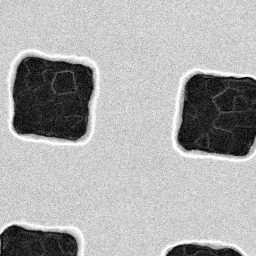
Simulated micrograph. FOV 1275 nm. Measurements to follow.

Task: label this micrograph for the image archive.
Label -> holes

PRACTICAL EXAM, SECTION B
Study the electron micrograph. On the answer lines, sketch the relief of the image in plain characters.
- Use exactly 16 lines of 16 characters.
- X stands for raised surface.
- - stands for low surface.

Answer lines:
XXXXXXXXXXXXXXXX
XXXXXXXXXXXXXXXX
XXXXXXXXXXXXXXXX
XX-XXXXXXXXXXXXX
X-----XXXXXXXXXX
X-----XXXXX-----
X-----XXXXX-----
X-----XXXXX-----
XX---XXXXXX-----
XXXXXXXXXXXX----
XXXXXXXXXXXXXXXX
XXXXXXXXXXXXXXXX
XXXXXXXXXXXXXXXX
XXXXXXXXXXXXXXXX
----XXXXXXXXXXXX
-----XXXXXX----X